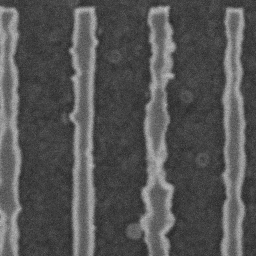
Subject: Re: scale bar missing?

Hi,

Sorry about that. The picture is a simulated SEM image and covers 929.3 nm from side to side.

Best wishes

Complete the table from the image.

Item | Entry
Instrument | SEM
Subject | one or a few lines or trenches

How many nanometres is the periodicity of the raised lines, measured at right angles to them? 273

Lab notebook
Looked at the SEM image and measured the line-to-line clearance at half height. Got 214 nanometres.